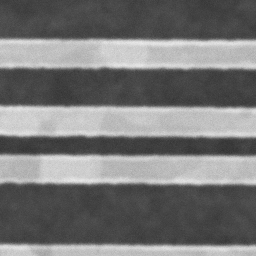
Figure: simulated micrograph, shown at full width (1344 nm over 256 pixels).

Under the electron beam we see lines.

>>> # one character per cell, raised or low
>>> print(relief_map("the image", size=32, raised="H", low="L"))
LLLLLLLLLLLLLLLLLLLLLLLLLLLLLLLL
LLLLLLLLLLLLLLLLLLLLLLLLLLLLLLLL
LLLLLLLLLLLLLLLLLLLLLLLLLLLLLLLL
LLLLLLLLLLLLLLLLLLLLLLLLLLLLLLLL
LLLLLLLLLLLLLLLLLLLLLLLLLLLLLLLL
HHHHHHHHHHHHHHHHHHHHHHHHHHHHHHHH
HHHHHHHHHHHHHHHHHHHHHHHHHHHHHHHH
HHHHHHHHHHHHHHHHHHHHHHHHHHHHHHHH
LLLLLLLLLLLLLLLLLLLLLLLHLLLLLLLH
LLLLLLLLLLLLLLLLLLLLLLLLLLLLLLLL
LLLLLLLLLLLLLLLLLLLLLLLLLLLLLLLL
LLLLLLLLLLLLLLLLLLLLLLLLLLLLLLLL
LLLLLLLLLLLLLLLLLLLLLLLLLLLLLLLL
LHHLLLLLLLLLLLLLLLLLLLLLLLLLLLLL
HHHHHHHHHHHHHHHHHHHHHHHHHHHHHHHH
HHHHHHHHHHHHHHHHHHHHHHHHHHHHHHHH
HHHHHHHHHHHHHHHHHHHHHHHHHHHHHHHH
LLLLLLLLLLLLLLLLLLLLLLLLLLLLLLLL
LLLLLLLLLLLLLLLLLLLLLLLLLLLLLLLL
LLLLLLLLLLLLLLLLLLLLLLLLLLLLLLLL
HHHHHHHHHHHHHHHHHHHHHHHHHHHHHHHH
HHHHHHHHHHHHHHHHHHHHHHHHHHHHHHHH
HHHHHHHHHHHHHHHHHHHHHHHHHHHHHHHH
LLLLLLLLLLLLLLLLLLLLLLLLLLLLLLLL
LLLLLLLLLLLLLLLLLLLLLLLLLLLLLLLL
LLLLLLLLLLLLLLLLLLLLLLLLLLLLLLLL
LLLLLLLLLLLLLLLLLLLLLLLLLLLLLLLL
LLLLLLLLLLLLLLLLLLLLLLLLLLLLLLLL
LLLLLLLLLLLLLLLLLLLLLLLLLLLLLLLL
LLLLLLLLLLLLLLLLLLLLLLLLLLLLLLLL
LLLLLLLLLLLLLLLLLLLLLLLLLLLLLLLL
HHHHHHHHHHHHHHHHHHHHHHHHHHHHHHHH